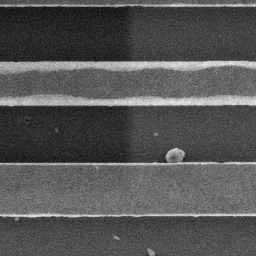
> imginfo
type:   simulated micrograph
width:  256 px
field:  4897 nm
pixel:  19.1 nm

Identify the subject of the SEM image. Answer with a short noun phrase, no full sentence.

lines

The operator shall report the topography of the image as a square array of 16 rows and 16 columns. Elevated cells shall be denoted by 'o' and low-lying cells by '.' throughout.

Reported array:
................
................
................
................
oooooooooooooooo
oooooooooooooooo
................
................
................
................
oooooooooooooooo
oooooooooooooooo
oooooooooooooooo
ooo.ooo.o.......
................
................